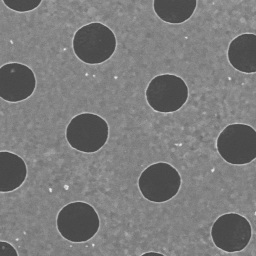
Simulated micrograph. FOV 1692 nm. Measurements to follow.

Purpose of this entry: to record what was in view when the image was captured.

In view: holes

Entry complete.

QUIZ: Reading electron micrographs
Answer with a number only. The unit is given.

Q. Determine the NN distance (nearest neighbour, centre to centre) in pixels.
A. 87.9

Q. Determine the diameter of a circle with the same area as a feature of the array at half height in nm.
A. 268